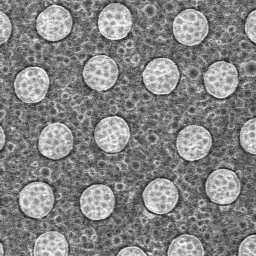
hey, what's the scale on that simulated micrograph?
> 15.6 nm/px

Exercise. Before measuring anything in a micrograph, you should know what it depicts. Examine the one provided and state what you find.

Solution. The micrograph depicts a regular array of raised bodies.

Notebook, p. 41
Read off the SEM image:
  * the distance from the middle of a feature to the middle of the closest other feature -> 885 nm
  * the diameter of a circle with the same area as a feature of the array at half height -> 539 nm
